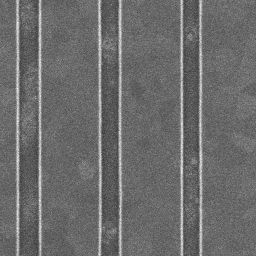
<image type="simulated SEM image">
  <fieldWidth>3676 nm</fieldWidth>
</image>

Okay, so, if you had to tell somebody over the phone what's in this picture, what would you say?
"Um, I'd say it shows one or a few lines or trenches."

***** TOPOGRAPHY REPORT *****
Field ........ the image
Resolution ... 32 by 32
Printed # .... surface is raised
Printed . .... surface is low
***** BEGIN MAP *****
##...#######...########..#######
##...#######...########..#######
##...#######...########..#######
##...#######...########..#######
##...#######...########..#######
##...#######...########..#######
##...#######...########..#######
##...#######...########..#######
##...#######...########..#######
##...#######...########..#######
##...#######...########..#######
##...#######...########..#######
##...#######...########..#######
##...#######...########..#######
##...#######...########..#######
##...#######...########..#######
##...#######...########..#######
##...#######...########..#######
##...#######...########..#######
##...#######...########..#######
##...#######...########..#######
##...#######...########..#######
##...#######...########..#######
##...#######...########..#######
##...#######...########..#######
##...#######...########..#######
##...#######...########..#######
##...#######...########..#######
##...#######...########..#######
##...#######...########..#######
##...#######...########..#######
##...#######...########..#######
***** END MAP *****